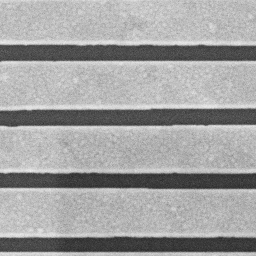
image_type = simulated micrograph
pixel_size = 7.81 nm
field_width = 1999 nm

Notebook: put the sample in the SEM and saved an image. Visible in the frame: lines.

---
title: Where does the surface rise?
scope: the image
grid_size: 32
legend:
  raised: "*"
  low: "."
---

********************************
********************************
********************************
********************************
********************************
..........*.........*.**.*******
................................
................................
********************************
********************************
********************************
********************************
********************************
*******************.............
................................
................................
********************************
********************************
********************************
********************************
********************************
....*****....****...**.**..*****
................................
................................
********************************
********************************
********************************
********************************
********************************
***************..*.********..***
................................
................................